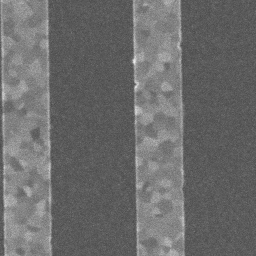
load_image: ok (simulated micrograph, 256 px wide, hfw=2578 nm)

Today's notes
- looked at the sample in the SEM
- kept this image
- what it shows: one or a few lines or trenches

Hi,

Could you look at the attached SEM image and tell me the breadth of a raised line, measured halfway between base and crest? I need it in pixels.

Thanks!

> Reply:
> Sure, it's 46.2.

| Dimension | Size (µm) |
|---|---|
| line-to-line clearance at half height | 0.863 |